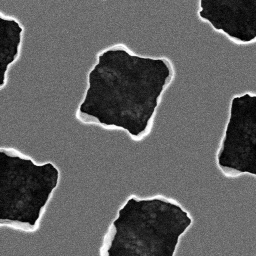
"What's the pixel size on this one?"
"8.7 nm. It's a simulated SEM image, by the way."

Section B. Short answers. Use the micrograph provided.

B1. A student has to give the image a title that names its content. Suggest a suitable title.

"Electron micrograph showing holes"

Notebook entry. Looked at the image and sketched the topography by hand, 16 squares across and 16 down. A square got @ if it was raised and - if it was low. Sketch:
@@@@@@@@@@@@@---
-@@@@@@@@@@@@---
-@@@@@@@@@@@@@@-
-@@@@@--@@@@@@@@
@@@@@@-----@@@@@
@@@@@@----@@@@@@
@@@@@-----@@@@@-
@@@@@----@@@@@--
@@@@@@@@@@@@@@--
-@@@@@@@@@@@@@--
---@@@@@@@@@@@--
---@@@@@@@@@@@@@
---@@@@@--@@@@@@
--@@@@@-----@@@@
@@@@@@@----@@@@@
@@@@@@@----@@@@@